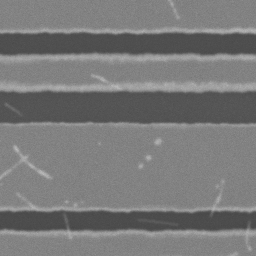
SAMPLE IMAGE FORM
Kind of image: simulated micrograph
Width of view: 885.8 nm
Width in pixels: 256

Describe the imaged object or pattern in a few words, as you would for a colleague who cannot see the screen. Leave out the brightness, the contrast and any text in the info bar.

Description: lines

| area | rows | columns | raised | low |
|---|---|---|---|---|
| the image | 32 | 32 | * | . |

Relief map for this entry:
********************************
********************************
********************************
********************************
................................
................................
................................
********************************
********************************
********************************
********************************
................................
................................
................................
................................
*****************************.**
********************************
********************************
********************************
********************************
********************************
********************************
********************************
********************************
********************************
********************************
.......................*........
................................
................................
********************************
********************************
********************************